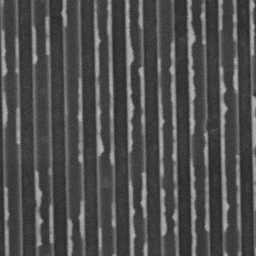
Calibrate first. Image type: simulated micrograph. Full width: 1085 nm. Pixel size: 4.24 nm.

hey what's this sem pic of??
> parallel lines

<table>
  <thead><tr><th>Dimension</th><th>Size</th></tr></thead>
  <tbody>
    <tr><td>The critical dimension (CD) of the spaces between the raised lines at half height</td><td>57.8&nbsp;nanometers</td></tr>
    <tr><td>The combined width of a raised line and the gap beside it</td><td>0.132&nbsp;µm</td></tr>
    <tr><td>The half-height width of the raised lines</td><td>17.6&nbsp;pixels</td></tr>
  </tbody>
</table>